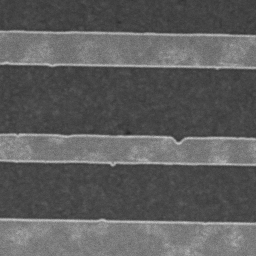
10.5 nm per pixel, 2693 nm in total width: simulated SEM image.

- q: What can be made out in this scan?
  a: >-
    one or a few lines or trenches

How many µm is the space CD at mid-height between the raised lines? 0.675